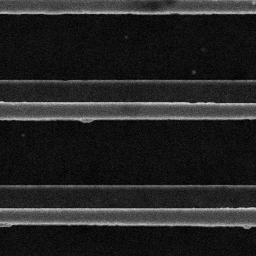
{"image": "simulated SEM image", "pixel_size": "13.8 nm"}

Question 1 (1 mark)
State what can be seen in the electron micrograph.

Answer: lines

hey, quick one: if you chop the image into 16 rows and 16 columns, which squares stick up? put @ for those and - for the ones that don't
@@@@@@@@@@@@@@@@
----------------
----------------
----------------
----------------
@@@@@@@@@@@@@@@@
@@@@@@@@@@@@@@@@
-----@----------
----------------
----------------
----------------
----------------
@@@@@@@@@@@@@@@@
@@@@@@@@@@@@@@@@
----------------
----------------